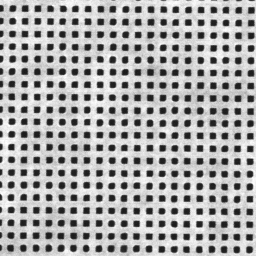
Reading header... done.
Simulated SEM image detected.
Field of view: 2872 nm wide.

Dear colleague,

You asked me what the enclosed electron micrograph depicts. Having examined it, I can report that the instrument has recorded a regular array of holes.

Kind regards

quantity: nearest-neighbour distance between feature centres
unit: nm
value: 137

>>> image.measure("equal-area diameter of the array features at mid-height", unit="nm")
84.9